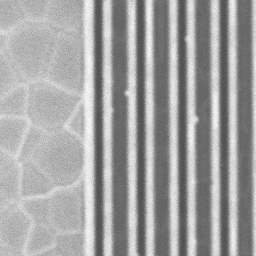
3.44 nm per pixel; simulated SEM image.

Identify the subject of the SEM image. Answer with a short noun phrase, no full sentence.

parallel lines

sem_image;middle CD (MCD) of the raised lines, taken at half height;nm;32.7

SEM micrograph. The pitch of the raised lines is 70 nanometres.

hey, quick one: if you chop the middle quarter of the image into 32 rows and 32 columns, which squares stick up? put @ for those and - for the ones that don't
-----@@@--@@----@@--@@----@@---@
-----@@@--@@----@@--@@----@@---@
-----@@@--@@----@@--@@----@@---@
-----@@@--@@----@@--@@----@@---@
-----@@@--@@----@@--@@----@@---@
-----@@@--@@----@@--@@----@@---@
-----@@@--@@----@@--@@----@@---@
-----@@@--@@----@@--@@----@@---@
-----@@@--@@----@@--@@----@@---@
-----@@@--@@----@@--@@----@@---@
-----@@@--@@----@@--@@----@@@--@
-----@@@--@@----@@--@@----@@@--@
-----@@@--@@----@@--@@----@@@--@
-----@@@--@@----@@--@@----@@@--@
-----@@@--@@----@@--@@----@@@--@
-----@@@--@@----@@--@@----@@@--@
-----@@@--@@----@@--@@----@@@--@
------@@--@@----@@--@@----@@@--@
------@@--@@----@@--@@----@@@--@
------@@--@@----@@--@@@---@@@--@
------@@--@@----@@--@@@---@@@--@
------@@--@@----@@--@@@---@@@--@
------@@--@@----@@--@@@---@@@--@
------@@--@@----@@--@@@---@@@--@
------@@--@@----@@--@@@---@@@--@
------@@--@@----@@--@@@---@@@--@
------@@--@@----@@--@@@---@@@--@
------@@--@@----@@--@@@---@@@--@
------@@--@@----@@--@@----@@@--@
------@@--@@----@@--@@@---@@@--@
------@@--@@----@@--@@----@@@--@
------@@--@@----@@--@@@---@@@--@